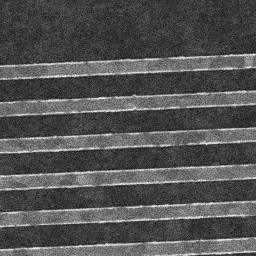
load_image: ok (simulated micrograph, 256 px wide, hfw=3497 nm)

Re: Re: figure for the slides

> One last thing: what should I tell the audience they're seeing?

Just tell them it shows parallel lines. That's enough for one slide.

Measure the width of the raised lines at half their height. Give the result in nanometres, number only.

201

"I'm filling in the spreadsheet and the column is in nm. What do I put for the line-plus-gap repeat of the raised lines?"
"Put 502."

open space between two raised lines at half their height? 300 nanometres